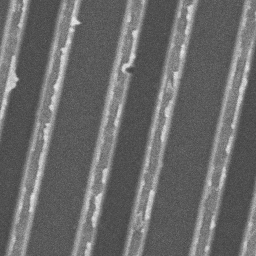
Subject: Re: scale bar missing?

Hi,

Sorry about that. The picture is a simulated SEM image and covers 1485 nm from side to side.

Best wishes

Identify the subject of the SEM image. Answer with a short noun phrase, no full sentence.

parallel lines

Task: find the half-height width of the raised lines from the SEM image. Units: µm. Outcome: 0.0921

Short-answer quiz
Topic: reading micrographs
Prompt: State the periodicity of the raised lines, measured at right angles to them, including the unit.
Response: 342 nanometres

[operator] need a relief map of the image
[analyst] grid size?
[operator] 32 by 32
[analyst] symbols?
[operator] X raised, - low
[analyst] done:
--X-----XX------XX----XX-------X
-XX-----XX------XX----XX-------X
-XX----XXX------XX----XX------XX
-XX----XX------XX-----XX------XX
-XX----XX------XX-----X-------XX
XX-----XX------XX----XX-------XX
XX----XX-------XX----XX------XX-
XX----XX-------XX----XX------XX-
XX----XX------XX-----XX------XX-
XX----XX------XX----XX-------XX-
XX----XX------XX----XX-------XX-
X----XX-------XX----XX------XX--
X----XX------XX-----XX------XX--
X----XX------XX-----X-------XX--
-----XX------XX----XX-------XX--
----XX-------XX----XX------XXX--
----XX-------XX----XX------XX---
----XX------XX-----XX------XX---
----XX------XX----XX-------XX---
----XX------XX----XX-------XX---
---XX-------XX----XX------XX----
---XX------XXX----XX------XX----
---XX------XX-----XX------XX----
---XX------XX----XX-------XX----
---X-------XX----XX------XXX----
--XX-------XX----XX------XX-----
--XX------XX-----XX------XX----X
--XX------XX-----X-------XX----X
--XX------XX----XX-------XX----X
-XX-------XX----XX------XX-----X
-XX-------XX----XX------XX----XX
-XX------XX-----XX------XX----XX